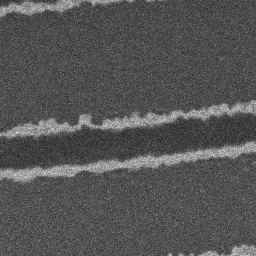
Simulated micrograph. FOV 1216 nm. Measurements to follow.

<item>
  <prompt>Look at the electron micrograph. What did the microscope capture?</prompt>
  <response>one or a few lines or trenches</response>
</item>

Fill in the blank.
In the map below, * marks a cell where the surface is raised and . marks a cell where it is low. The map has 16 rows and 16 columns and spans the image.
**..............
................
................
................
................
................
................
.........*******
****************
***************.
******..........
................
................
................
................
................